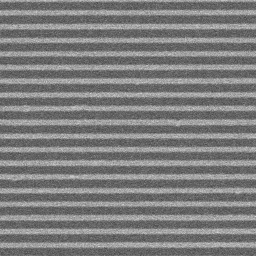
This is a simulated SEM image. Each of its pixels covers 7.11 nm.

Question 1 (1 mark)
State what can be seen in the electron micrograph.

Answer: parallel lines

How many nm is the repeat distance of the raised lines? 97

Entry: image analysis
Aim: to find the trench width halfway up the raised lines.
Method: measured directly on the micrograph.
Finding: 65.8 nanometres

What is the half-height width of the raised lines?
30.2 nm